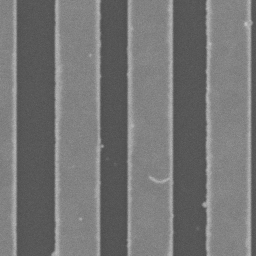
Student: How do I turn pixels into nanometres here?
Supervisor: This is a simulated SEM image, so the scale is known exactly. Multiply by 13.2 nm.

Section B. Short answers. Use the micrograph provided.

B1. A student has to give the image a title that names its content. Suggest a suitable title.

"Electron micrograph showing lines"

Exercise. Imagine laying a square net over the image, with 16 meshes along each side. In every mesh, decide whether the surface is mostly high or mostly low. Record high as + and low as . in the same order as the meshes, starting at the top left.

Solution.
+..+++..+++..+++
+..+++..+++..+++
+..+++..+++..+++
+..+++..+++..+++
+...++..+++..+++
+..+++..+++..+++
+..+++..+++..+++
+..+++..+++..+++
+..+++..+++..+++
+..+++..+++..+++
+..+++..+++..+++
+..+++..+++..+++
+..+++..+++..+++
+..+++..+++..+++
+..+++..+++..+++
+..+++..+++..+++